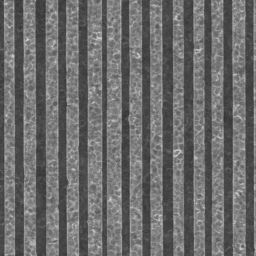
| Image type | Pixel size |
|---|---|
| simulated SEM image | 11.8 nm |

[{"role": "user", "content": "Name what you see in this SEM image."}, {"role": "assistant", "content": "parallel lines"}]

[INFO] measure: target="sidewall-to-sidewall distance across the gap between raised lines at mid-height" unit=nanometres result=110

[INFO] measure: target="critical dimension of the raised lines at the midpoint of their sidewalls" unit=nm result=138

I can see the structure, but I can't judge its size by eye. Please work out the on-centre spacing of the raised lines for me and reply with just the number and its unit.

0.247 micrometres